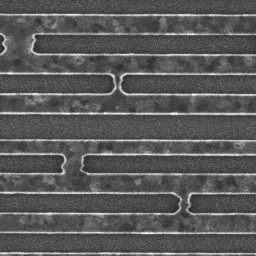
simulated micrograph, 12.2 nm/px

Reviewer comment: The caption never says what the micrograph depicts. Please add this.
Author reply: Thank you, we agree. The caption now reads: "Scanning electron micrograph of parallel lines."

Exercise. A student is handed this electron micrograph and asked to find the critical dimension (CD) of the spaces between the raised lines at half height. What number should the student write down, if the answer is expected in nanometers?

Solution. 249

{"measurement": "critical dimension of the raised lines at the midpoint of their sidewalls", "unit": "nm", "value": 238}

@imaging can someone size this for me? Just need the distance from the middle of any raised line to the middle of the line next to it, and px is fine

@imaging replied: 39.7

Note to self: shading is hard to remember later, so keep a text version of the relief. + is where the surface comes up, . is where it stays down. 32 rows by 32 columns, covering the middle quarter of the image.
++++++++++++++++++++++++++++++++
++++++++++++++++++++++++++++++++
...........+++++................
............++..................
.............+..................
.............+..................
............++..................
...........+++++................
++++++++++++++++++++++++++++++++
++++++++++++++++++++++++++++++++
++++++++++++++++++++++++++++++++
++++++++++++++++++++++++++++++++
................................
................................
................................
................................
................................
................................
................................
++++++++++++++++++++++++++++++++
++++++++++++++++++++++++++++++++
++++++++++++++++++++++++++++++++
++++++..++++++++++++++++++++++++
++++............................
++++............................
+++++...........................
++++............................
++++++..........................
++++++++++++++++++++++++++++++++
++++++++++++++++++++++++++++++++
++++++++++++++++++++++++++++++++
++++++++++++++++++++++++++++++++